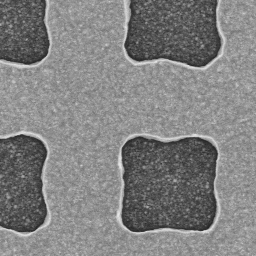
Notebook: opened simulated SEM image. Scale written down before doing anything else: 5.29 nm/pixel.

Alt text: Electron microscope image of holes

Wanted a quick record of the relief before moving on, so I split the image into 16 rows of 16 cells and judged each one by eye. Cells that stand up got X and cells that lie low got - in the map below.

---XXXXX------XX
---XXXXX------XX
---XXXXX------XX
---XXXXX------XX
XXXXXXXXXXXXXXXX
XXXXXXXXXXXXXXXX
XXXXXXXXXXXXXXXX
XXXXXXXXXXXXXXXX
X-XXXXXXXXXXXXXX
---XXXXX------XX
---XXXXX------XX
---XXXXX-----XXX
---XXXXX------XX
---XXXXX-----XXX
X-XXXXXXXXXXXXXX
XXXXXXXXXXXXXXXX